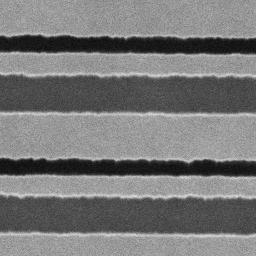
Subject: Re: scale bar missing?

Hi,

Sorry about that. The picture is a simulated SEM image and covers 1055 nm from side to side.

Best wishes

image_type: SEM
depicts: lines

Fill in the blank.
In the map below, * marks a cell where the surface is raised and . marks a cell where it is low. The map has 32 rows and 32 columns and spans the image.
********************************
********************************
********************************
********************************
.*....*..***********************
................................
................................
********************************
********************************
................................
................................
................................
................................
................................
********************************
********************************
********************************
********************************
********************************
********************************
................................
................................
********************************
********************************
..*............********..*******
................................
................................
................................
................................
******************************.*
********************************
********************************